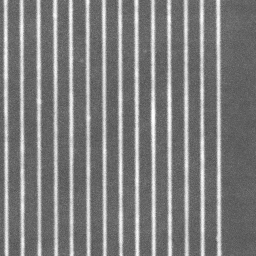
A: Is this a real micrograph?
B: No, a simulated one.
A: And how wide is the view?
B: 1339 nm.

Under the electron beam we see parallel lines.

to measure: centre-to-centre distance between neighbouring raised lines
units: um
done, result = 0.0855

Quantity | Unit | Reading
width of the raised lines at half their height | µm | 0.0105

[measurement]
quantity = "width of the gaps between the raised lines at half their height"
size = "13.5 pixels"